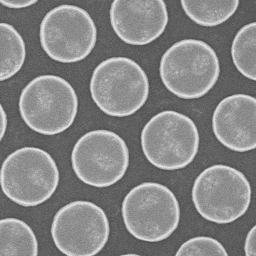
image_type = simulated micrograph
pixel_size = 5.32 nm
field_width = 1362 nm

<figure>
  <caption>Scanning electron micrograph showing a regular array of raised bodies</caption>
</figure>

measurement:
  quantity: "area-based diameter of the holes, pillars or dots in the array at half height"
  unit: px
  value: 56.8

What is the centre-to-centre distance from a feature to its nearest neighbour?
388 nm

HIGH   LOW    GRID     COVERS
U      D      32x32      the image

DUUUDDDDDDDDDDUUUUUUDDDUUUUUUUDD
DDDDDDUUUUDDDDUUUUUUUDDUUUUUUDDD
DDDDDDUUUUUDDDUUUUUUUDDDUUUUDDDD
UDDDDUUUUUUUDDUUUUUUUDDDDDDDDDDU
UUDDDUUUUUUUDDDUUUUUDDDDDDDDDDUU
UUUDDUUUUUUUDDDDDUDDDDUUUDDDDUUU
UUUDDDUUUUUDDDDDDDDDDUUUUUUDDUUU
UUUDDDDUUUDDDDUUDDDDUUUUUUUDDUUU
UUDDDDDDDDDDUUUUUDDDUUUUUUUDDDUU
UDDDDDDDDDDDUUUUUUDDUUUUUUUDDDDU
DDDDUUUUDDDUUUUUUUDDDUUUUUUDDDDD
DDDUUUUUUDDUUUUUUUDDDDUUUUDDDDDD
DDDUUUUUUUDDUUUUUUDDDDDDDDDDUUUU
DDDUUUUUUUDDDUUUUDDDDDDDDDDUUUUU
UDDUUUUUUDDDDDDDDDDUUUUDDDDUUUUU
UDDUUUUUUDDDDDDDDDUUUUUUDDDUUUUU
UDDDDUUDDDDDUDDDDDUUUUUUUDDUUUUU
DDDDDDDDDDUUUUUDDDUUUUUUUDDDUUUU
DDDDDDDDDUUUUUUUDDUUUUUUUDDDDUUU
DUUUUUDDDUUUUUUUDDUUUUUUDDDDDDDD
UUUUUUUDDUUUUUUUDDDUUUUDDDDDDDDD
UUUUUUUDDDUUUUUUDDDDDDDDDUUUUUDD
UUUUUUUDDDUUUUUDDDDDDDDDDUUUUUUD
UUUUUUUDDDDDDDDDDUUUUDDDUUUUUUUD
DUUUUUDDDDDDDDDDUUUUUUDDUUUUUUUD
DDDUDDDDDUUDDDDUUUUUUUDDUUUUUUUD
DDDDDDDDUUUUUDDUUUUUUUDDDUUUUUDD
UUDDDDDUUUUUUDDDUUUUUUDDDDUUUDDD
UUUUDDDUUUUUUDDDUUUUUUDDDDDDDDDD
UUUUDDDUUUUUUDDDDUUUUDDDDDDDDDDU
UUUUUDDUUUUUUDDDDDDDDDDUUUUDDDDU
UUUUUDDDUUUUDDDDDDDDDDUUUUUUDDDU